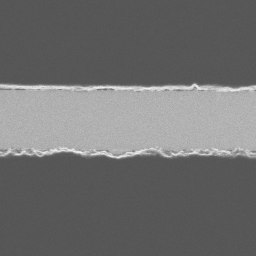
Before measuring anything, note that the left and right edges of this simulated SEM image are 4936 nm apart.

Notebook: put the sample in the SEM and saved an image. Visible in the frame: one or a few lines or trenches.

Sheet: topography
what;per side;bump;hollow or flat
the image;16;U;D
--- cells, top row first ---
UUUUUUUUUUUUUUUU
UUUUUUUUUUUUUUUU
UUUUUUUUUUUUUUUU
UUUUUUUUUUUUUUUU
UUUUUUUUUUUUUUUU
DDDDDUDUUUUDDUUU
DDDDDDDDDDDDDDDD
DDDDDDDDDDDDDDDD
DDDDDDDDDDDDDDDD
DDDUUDDDDUDDDDDD
UUUUUUUUUUUUUUUU
UUUUUUUUUUUUUUUU
UUUUUUUUUUUUUUUU
UUUUUUUUUUUUUUUU
UUUUUUUUUUUUUUUU
UUUUUUUUUUUUUUUU